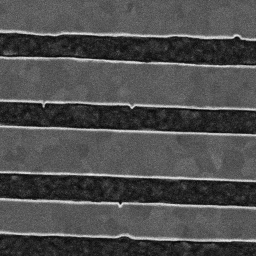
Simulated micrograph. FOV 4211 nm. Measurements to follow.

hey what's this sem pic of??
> one or a few lines or trenches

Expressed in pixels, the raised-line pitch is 68.5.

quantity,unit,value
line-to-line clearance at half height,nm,432